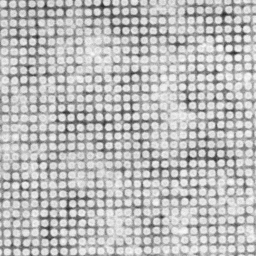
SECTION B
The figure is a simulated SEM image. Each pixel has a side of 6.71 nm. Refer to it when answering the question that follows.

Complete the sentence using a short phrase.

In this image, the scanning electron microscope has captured a regular array of raised bodies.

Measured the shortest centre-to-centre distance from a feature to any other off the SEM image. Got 60.4 nm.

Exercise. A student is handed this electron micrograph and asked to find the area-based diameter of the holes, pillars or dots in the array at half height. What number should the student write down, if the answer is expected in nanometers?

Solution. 45.4